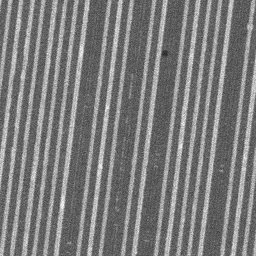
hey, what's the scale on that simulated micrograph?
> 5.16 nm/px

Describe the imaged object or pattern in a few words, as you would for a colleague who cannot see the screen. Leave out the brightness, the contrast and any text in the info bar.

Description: parallel lines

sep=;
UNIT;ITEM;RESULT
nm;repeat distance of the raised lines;56.6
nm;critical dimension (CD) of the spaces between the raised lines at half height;38.4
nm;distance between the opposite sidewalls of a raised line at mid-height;17.3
